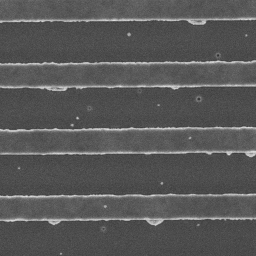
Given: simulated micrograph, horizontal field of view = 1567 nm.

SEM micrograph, lines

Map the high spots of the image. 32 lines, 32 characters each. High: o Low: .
oooooooooooooooooooooooooooooooo
oooooooooooooooooooooooooooooooo
ooooooooooooooooooo.oooo........
................................
................................
................................
................................
................................
oooooooooooooooooooooooooooooooo
oooooooooooooooooooooooooooooooo
oooooooooooooooooooooooooooooooo
................................
................................
................................
................................
................................
oooooooooooooooooooooooooooooooo
oooooooooooooooooooooooooooooooo
oooooooooooooooooooooooooooooooo
................................
................................
................................
................................
................................
.......o...ooooooooooooooooooooo
oooooooooooooooooooooooooooooooo
oooooooooooooooooooooooooooooooo
oooooooooooooo.oo...............
................................
................................
................................
................................